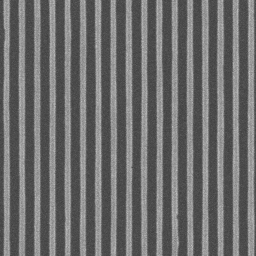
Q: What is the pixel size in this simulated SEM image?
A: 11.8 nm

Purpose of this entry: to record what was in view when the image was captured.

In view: parallel lines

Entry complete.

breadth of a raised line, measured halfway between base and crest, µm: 0.0531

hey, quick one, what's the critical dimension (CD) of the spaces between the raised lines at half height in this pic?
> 0.127 um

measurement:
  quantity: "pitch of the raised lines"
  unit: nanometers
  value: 180